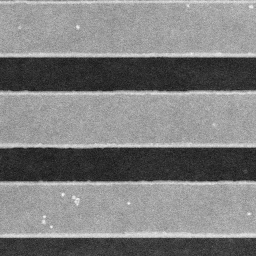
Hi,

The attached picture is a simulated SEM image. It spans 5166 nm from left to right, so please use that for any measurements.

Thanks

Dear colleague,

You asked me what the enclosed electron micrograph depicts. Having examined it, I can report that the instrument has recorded lines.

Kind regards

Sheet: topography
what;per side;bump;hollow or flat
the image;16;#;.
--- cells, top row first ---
################
################
################
################
................
................
################
################
################
................
................
################
################
################
################
................